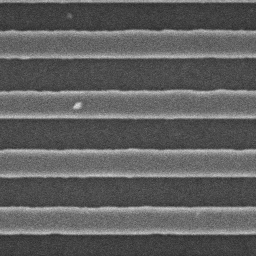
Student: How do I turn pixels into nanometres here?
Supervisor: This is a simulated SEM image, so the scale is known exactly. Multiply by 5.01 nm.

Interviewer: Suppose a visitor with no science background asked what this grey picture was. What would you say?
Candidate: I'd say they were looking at lines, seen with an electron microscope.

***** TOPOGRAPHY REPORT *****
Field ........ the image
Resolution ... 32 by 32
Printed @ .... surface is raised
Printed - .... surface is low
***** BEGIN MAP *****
--------------------------------
--------------------------------
--------------------------------
--------------------------------
@@@@@@@@@@@@@@@@@@@@@@@@@@@@@@@@
@@@@@@@@@@@@@@@@@@@@@@@@@@@@@@@@
@@@@@@@@@@@@@@@@@@@@@@@@@@@@@@@@
--------------------------------
--------------------------------
--------------------------------
--------------------------------
@@@@@@@@@@@@@@@@@@@@@@@@@@@@@@@@
@@@@@@@@@@@@@@@@@@@@@@@@@@@@@@@@
@@@@@@@@@@@@@@@@@@@@@@@@@@@@@@@@
@@@@@@@@@@@@@@@@@@@@@@@@@@@@@@@@
--------------------------------
--------------------------------
--------------------------------
--------------------------------
@@@@@@@@@@@@@@@@@@@@@@@@@@@@@@@@
@@@@@@@@@@@@@@@@@@@@@@@@@@@@@@@@
@@@@@@@@@@@@@@@@@@@@@@@@@@@@@@@@
--------------------------------
--------------------------------
--------------------------------
--------------------------------
@@@@@@@@@@@@@@@@@@@@@@@@@@@@@@@@
@@@@@@@@@@@@@@@@@@@@@@@@@@@@@@@@
@@@@@@@@@@@@@@@@@@@@@@@@@@@@@@@@
--------------------------------
--------------------------------
--------------------------------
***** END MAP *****